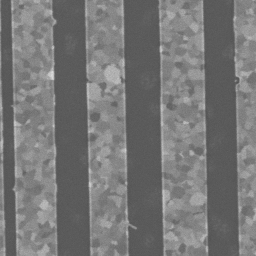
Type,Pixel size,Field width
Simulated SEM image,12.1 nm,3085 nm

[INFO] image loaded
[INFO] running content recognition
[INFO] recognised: one or a few lines or trenches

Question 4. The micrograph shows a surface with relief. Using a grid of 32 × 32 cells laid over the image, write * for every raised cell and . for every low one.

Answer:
..****.....****.....*****....***
..****.....****.....*****....***
..*****....****.....*****....***
..*****....****.....*****....***
..*****....****.....*****....***
..*****....****.....*****....***
..*****....****.....*****...****
..*****....****.....*****....***
..*****....*****....*****....***
..*****....*****....******....**
..*****....*****....******....**
..*****....*****....******....**
..*****....*****....*****.....**
..*****....*****....*****.....**
..*****....*****....*****.....**
..*****....*****....******....**
..*****....*****....******....**
..*****....*****....******....**
..*****....*****....******....**
..*****....*****....******....**
..*****....*****....******....**
..*****....*****....******....**
..*****....*****....******....**
..*****....*****....******....**
..*****....*****....******....**
..*****....*****....******....**
..*****....*****....******....**
..*****....*****.....*****....**
..*****....*****.....*****....**
..*****....*****.....*****....**
*.*****....*****.....*****....**
*.*****....*****.....*****....**